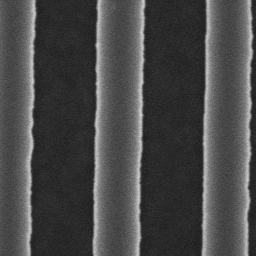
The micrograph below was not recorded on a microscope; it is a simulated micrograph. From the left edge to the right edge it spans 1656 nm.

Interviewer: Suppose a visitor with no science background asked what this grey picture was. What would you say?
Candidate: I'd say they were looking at lines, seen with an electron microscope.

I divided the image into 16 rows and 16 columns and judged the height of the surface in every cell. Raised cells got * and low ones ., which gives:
**....***....***
**....***....***
**....***....***
**....***....***
**....***....***
**....***....***
**....***....***
**....***....***
**....***....***
**....***....***
**....***....***
**....***....**.
**....***....***
**....***....**.
**....***....**.
**....***....**.